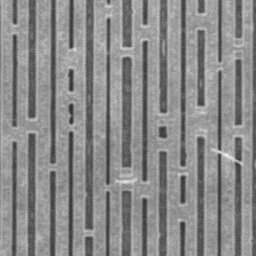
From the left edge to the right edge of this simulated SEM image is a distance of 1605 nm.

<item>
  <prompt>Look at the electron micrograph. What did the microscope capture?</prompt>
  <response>parallel lines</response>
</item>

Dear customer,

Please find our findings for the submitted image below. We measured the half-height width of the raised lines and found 69.8 nanometers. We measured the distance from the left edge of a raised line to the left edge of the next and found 0.116 microns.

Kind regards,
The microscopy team